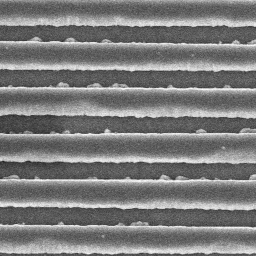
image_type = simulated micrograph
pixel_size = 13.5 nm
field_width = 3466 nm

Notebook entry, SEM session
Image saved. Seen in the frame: lines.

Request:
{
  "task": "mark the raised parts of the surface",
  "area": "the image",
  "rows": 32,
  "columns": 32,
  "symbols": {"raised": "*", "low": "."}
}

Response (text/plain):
********************************
********************************
********************************
................................
................................
***********************.........
********************************
********************************
********************************
................................
................................
********************************
********************************
********************************
............................****
................................
................................
********************************
********************************
********************************
................................
................................
.*..............................
********************************
********************************
********************************
................................
................................
*******************************.
********************************
********************************
...........****.********.*....**